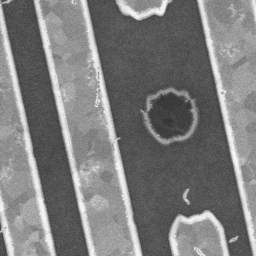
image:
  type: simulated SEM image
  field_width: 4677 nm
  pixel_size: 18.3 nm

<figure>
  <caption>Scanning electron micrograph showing one or a few lines or trenches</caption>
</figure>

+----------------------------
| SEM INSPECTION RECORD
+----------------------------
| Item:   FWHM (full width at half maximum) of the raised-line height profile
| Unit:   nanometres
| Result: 819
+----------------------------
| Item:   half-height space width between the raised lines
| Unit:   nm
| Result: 718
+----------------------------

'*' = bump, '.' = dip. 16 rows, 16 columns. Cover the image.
..***...**...***
...***.......***
...***.......***
*..***.......***
*..***........**
*...**........**
*...***..***..**
*...***..***..**
**..***...**..**
**..***........*
**...**........*
**...***.......*
***..***.......*
***..***........
***..***...***..
.**...***..***..